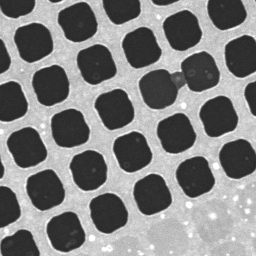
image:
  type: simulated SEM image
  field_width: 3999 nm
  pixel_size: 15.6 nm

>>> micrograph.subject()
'a regular array of holes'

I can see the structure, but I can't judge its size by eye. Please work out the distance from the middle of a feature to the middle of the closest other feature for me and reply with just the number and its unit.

722 nanometres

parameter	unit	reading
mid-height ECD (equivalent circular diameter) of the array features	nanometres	615